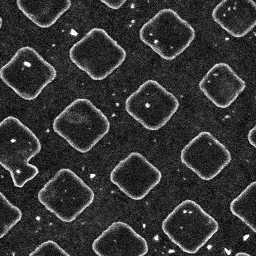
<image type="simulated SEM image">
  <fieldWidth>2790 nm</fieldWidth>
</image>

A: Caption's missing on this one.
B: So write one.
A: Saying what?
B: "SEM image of a regular array of raised bodies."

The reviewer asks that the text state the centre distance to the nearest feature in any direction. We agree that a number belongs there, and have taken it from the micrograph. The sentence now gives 789 nm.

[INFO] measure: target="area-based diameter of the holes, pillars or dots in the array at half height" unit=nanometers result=509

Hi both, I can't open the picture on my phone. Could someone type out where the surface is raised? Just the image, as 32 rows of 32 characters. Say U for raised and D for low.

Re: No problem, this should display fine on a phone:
DDUUUUUUUDDDDUUDDDDDDDDDDDDDUUUU
DDDUUUUUDDDDDDDDDDDDUUDDDDDUUUUU
DDDDUUUDDDDDDDDDDDDUUUUDDDDUUUUU
DDDDDDDDDDDDDDDDDDUUUUUUDDDDUUUD
DDDDDDDDDDDUUUDDDDUUUUUUDDDDDDDD
DDDDDDDDDDUUUUDDDDUUUUUUDDDDDDDD
DDUUDDDDDUUUUUUDDDDDUUUDDDDDDDDD
DUUUUDDDDUUUUUUDDDDDDDDDDDDDDDDD
UUUUUUUDDDUUUUDDDDDDDDDDDDDUUDDD
UUUUUUUDDDDUUDDDDDDDDDDDDDUUUUDD
DUUUUUDDDDDDDDDDDDUUDDDDDUUUUUDD
DDUUUDDDDDDDDDDDDUUUUDDDDDUUUUDD
DDDDDDDDDDUDDDDDUUUUUUDDDDUUUDDD
DDDDDDDDUUUUDDDDUUUUUUDDDDDDDDDD
DDDDDDDUUUUUUDDDDUUUUDDDDDDDDDDD
UUUDDDDUUUUUUUDDDDUUDDDDDDDDDDDD
UUUUDDDUUUUUUDDDDDDDDDDDDDDDDDDU
UUUUUDDDUUUUDDDDDDDDDDDDUUUDDDDU
UUUUUDDDDUUDDDDDDDDDDDDUUUUUDDDD
UUUUDDDDDDDDDDDDUUDDDDDUUUUUUDDD
UUUUDDDDDDDDDDDUUUUDDDDUUUUUDDDD
DUUUUDDUUDDDDDUUUUUUDDDDUUUDDDDD
DDUUDDUUUUDDDDUUUUUUDDDDDDDDDDDD
DDDDDUUUUUUDDDDUUUUDDDDDDDDDDDDU
DDDDDUUUUUUUDDDDUUDDDDDDDDDDDDUU
UDDDDUUUUUUDDDDDDDDDDDDUDDDDDUUU
UUDDDDDUUUDDDDDDDDDDDDUUUUDDDUUU
UUDDDDDDUDDDDDDDDDDDDUUUUUUDDDUU
UDDDDDDDDDDDDDUUDDDDUUUUUUUDDDDU
DDDDDDDDDDDDDUUUUDDDDUUUUUDDDDDD
DDDDDUUDDDDDUUUUUUDDDDUUUDDDDDDD
DDDDUUUUDDDDUUUUUUDDDDDUDDDDDDDD